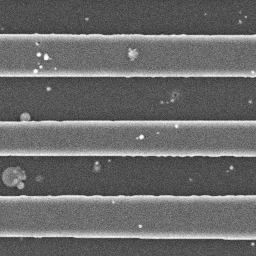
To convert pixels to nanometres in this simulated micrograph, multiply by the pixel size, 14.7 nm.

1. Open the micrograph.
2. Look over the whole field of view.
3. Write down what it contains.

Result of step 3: lines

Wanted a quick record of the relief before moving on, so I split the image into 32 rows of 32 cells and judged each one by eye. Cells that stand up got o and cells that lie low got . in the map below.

................................
................................
................................
................................
oooooooooooooooooooooooooooooooo
oooooooooooooooooooooooooooooooo
oooooooooooooooooooooooooooooooo
oooooooooooooooooooooooooooooooo
oooooooooooooooooooooooooooooooo
oooooooooooooooooooooooooooooooo
................................
................................
................................
................................
................................
oooooooooooooooooooooooooooooooo
oooooooooooooooooooooooooooooooo
oooooooooooooooooooooooooooooooo
oooooooooooooooooooooooooooooooo
................o..oooooo.oo.ooo
................................
................................
................................
................................
..oo..ooooooo.oooooooo.ooooooooo
oooooooooooooooooooooooooooooooo
oooooooooooooooooooooooooooooooo
oooooooooooooooooooooooooooooooo
oooooooooooooooooooooooooooooooo
oooooooooooooooooooooooooooooooo
................................
................................